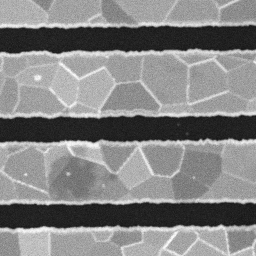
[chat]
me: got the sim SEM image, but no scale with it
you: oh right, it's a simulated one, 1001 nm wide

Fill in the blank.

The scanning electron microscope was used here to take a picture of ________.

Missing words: lines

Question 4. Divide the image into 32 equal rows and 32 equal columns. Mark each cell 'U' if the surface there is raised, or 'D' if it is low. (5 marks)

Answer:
UUUUUUUUUUUUUUUUUUUUUUUUUUUUUUUU
UUUUUUUUUUUUUUUUUUUUUUUUUUUUUUUU
UUUUUUUUUUUUUUUUUUUUUUUUUUUUUUUU
DDDDDDDDUDDDDDDDDDDDDDDDDDDDDDDD
DDDDDDDDDDDDDDDDDDDDDDDDDDDDDDDD
DDDDDDDDDDDDDDDDDDDDDDDDDDDDDDDD
DDDDUUDDDUUDUUUDUUUUUUUUUUUUUUUU
UUUUUUUUUUUUUUUUUUUUUUUUUUUUUUUU
UUUUUUUUUUUUUUUUUUUUUUUUUUUUUUUU
UUUUUUUUUUUUUUUUUUUUUUUUUUUUUUUU
UUUUUUUUUUUUUUUUUUUUUUUUUUUUUUUU
UUUUUUUUUUUUUUUUUUUUUUUUUUUUUUUU
UUUUUUUUUUUUUUUUUUUUUUUUUUUUUUUU
UUUUUUUUUUUUUUUUUUUUUUUUUUUUUUUU
UUUUUUUUUUUUUUUDUDUUDUUDUDDDDUDD
DDDDDDDDDDDDDDDDDDDDDDDDDDDDDDDD
DDDDDDDDDDDDDDDDDDDDDDDDDDDDDDDD
DDDDDDDDDDDDDDDDDDDDDDDDDDDDUDDU
UUUUUUUUUUUUUUUUUUUUUUUUUUUUUUUU
UUUUUUUUUUUUUUUUUUUUUUUUUUUUUUUU
UUUUUUUUUUUUUUUUUUUUUUUUUUUUUUUU
UUUUUUUUUUUUUUUUUUUUUUUUUUUUUUUU
UUUUUUUUUUUUUUUUUUUUUUUUUUUUUUUU
UUUUUUUUUUUUUUUUUUUUUUUUUUUUUUUU
UUUUUUUUUUUUUUUUUUUUUUUUUUUUUUUU
DDDDDUUDDUUDDDDDDDDDDDDDDDDDDDDD
DDDDDDDDDDDDDDDDDDDDDDDDDDDDDDDD
DDDDDDDDDDDDDDDDDDDDDDDDDDDDDDDD
DDDDDUUDDUUUUUUUUUUUUUUUUUUUUUUU
UUUUUUUUUUUUUUUUUUUUUUUUUUUUUUUU
UUUUUUUUUUUUUUUUUUUUUUUUUUUUUUUU
UUUUUUUUUUUUUUUUUUUUUUUUUUUUUUUU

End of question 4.